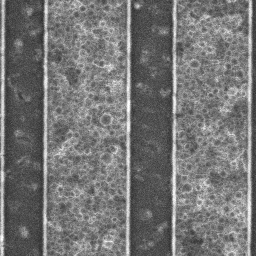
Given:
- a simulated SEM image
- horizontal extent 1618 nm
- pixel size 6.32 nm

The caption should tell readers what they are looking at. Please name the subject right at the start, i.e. one or a few lines or trenches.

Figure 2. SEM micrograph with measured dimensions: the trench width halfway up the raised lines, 280 nm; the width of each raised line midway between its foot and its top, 502 nm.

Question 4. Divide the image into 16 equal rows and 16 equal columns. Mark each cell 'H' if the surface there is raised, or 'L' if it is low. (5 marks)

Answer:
LLLHHHHHLLLHHHHH
LLLHHHHHLLLHHHHH
LLLHHHHHLLLHHHHH
LLLHHHHHLLLHHHHH
LLLHHHHHLLLHHHHH
LLLHHHHHLLLHHHHH
LLLHHHHHLLLHHHHH
LLLHHHHHLLLHHHHH
LLLHHHHHLLLHHHHH
LLLHHHHHLLLHHHHH
LLLHHHHHLLLHHHHH
LLLHHHHHLLLHHHHH
LLLHHHHHLLLHHHHH
LLLHHHHHLLLHHHHH
LLLHHHHHLLLHHHHH
LLLHHHHHLLLHHHHH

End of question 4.